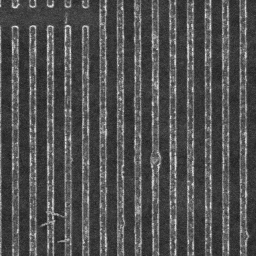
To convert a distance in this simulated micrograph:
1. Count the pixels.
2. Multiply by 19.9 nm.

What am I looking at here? parallel lines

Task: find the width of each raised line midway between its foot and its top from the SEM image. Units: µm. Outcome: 0.112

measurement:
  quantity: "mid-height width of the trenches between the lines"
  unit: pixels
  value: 12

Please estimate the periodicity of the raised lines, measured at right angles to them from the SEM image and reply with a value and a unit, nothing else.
349 nanometres